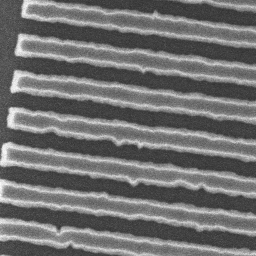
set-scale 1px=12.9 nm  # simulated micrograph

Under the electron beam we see parallel lines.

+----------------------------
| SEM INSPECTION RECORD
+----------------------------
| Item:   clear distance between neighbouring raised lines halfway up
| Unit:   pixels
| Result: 20.1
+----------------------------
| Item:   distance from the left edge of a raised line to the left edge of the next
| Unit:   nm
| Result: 477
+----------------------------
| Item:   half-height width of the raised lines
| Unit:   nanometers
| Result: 222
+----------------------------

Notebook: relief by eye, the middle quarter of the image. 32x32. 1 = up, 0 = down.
00000000000001111111111111111111
00000000000000000001101111111111
00000000000000000000000000000111
00000000000000000000000000000000
11111110000000000000000000000000
11111111111111100000000000000000
11111111111111111111100000000000
11111111111111111111111111110000
00000001111111111111111111111111
00000000000011111111111111111111
00000000000000000111111111111111
00000000000000000000000000111111
00000000000000000000000000000000
11110000000000000000000000000000
11111111100000000000000000000000
11111111111111111100000000000000
11111111111111111111111110000000
11111111111111111111111111111111
00000001100011111111111111111111
00000000000001101111111111111111
00000000000000000001101111111111
00000000000000000000000000000001
00000000000000000000000000000000
11111100000000000000000000000000
11111111111111100000000000000000
11111111111111111111110000000000
11111111111111111111111111111100
00000011111111111111111111111111
00000000000000111111111111111111
00000000000000001100111111111111
00000000000000000000000000000001
00000000000000000000000000000000